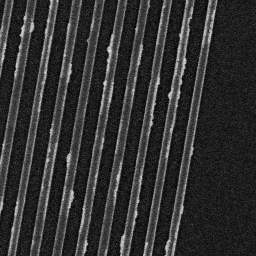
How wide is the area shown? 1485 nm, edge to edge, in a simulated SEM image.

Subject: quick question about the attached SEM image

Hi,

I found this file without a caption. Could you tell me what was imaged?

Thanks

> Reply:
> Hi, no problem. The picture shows parallel lines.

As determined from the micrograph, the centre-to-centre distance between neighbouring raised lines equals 130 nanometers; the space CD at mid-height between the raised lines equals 79.4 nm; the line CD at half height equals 50.8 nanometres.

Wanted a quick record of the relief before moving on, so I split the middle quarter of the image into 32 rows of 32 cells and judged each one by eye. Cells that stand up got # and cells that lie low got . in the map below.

##...##....##....##...##....##..
##...##....##...##....##....##..
##...##....##...##....##....##..
#....##....#....##....##...##...
#...###...##....##....##...##...
#...##....##....##....##...##...
#...##....##...###...##....##...
....##....##...##....##...###...
....##....##...##....##...###...
....##...###...##....##...##....
...###...##....##...###...##....
...##....##....##...##....##....
...##....##...###...##....##...#
...##....##...##....##....##...#
...##....##...##....##...###...#
...##....#....##....##...##....#
..###...##....##....##...##....#
..##....##....##...##....##....#
..##....##...###...##....##....#
..##....##...##....##....#....##
..##...###...##....##....#....##
..##...##....##....#....##....##
.###...##....##...##....##....##
.##....##....##...##....##....##
.##....##...###...##....##....#.
.##....##...##....##....#....##.
.##...###...##....##....#....##.
.##...##....##....#....##....##.
###...##....##....#....##....##.
##....##....##...##....##....##.
##....##...###...##....##....#..
##....##...##....##....##...##..